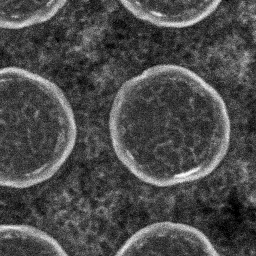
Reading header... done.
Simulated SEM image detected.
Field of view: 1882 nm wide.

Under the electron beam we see raised bodies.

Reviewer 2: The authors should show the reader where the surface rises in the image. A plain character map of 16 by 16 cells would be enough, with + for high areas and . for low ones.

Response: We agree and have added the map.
+++.....+++++...
++..............
................
................
+.........++....
+++.....+++++...
++++...+++++++..
++++...+++++++..
++++...+++++++..
++++....++++++..
+++.....+++++...
................
................
................
++.......+++....
++++....+++++...